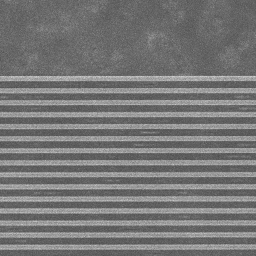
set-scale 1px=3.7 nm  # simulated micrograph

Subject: parallel lines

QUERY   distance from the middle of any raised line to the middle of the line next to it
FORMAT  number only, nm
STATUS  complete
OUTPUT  44.5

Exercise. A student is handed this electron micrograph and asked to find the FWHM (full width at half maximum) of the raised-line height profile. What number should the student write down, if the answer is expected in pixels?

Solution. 4.76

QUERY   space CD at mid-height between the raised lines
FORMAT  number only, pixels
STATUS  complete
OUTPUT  7.62